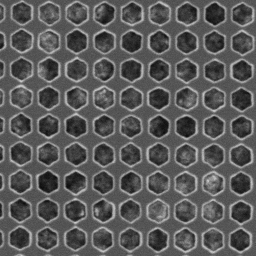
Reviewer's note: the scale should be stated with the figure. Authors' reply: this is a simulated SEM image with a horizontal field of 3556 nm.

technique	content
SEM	a regular array of holes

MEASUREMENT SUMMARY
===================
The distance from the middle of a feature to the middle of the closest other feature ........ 0.381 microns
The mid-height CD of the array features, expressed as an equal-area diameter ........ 292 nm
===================